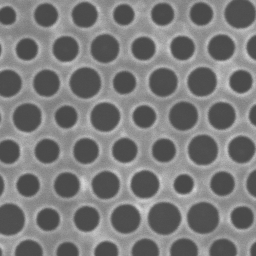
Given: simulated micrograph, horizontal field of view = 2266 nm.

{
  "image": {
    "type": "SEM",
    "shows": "a regular array of holes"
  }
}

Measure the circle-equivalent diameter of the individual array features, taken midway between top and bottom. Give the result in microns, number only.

0.232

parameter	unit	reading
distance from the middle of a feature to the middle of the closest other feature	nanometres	343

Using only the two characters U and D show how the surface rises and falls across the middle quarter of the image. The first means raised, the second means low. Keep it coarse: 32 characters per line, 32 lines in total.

UUUUUUUUUUUUUUUUUUUUUUUUUUUUUUUU
UUUDDDDDUUUUUUUUUUUUUUUDDDDUUUUU
UUDDDDDDDUUUUDDDDUUUUUDDDDDDUUUD
UDDDDDDDDUUUDDDDDDUUUDDDDDDDUUUD
UDDDDDDDDUUUDDDDDDUUUDDDDDDDDUUD
UDDDDDDDDUUUDDDDDDUUUDDDDDDDUUUD
UUDDDDDDDUUUUDDDDUUUUDDDDDDDUUUD
UUUDDDDDUUUUUUDDUUUUUUDDDDDUUUUU
UUUUDDDUUUUUUUUUUUUUUUUUUUUUUUUU
UUUUUUUUUUUUUUUUUUUUUUUUUUUUUDDU
DDUUUUUUDDDDDUUUUUDDDDUUUUUDDDDD
DDDUUUUDDDDDDDUUUUDDDDUUUUUDDDDD
DDDDUUUDDDDDDDUUUDDDDDDUUUDDDDDD
DDDDUUDDDDDDDDUUUDDDDDDUUUDDDDDD
DDDUUUUDDDDDDDUUUDDDDDDUUUUDDDDD
DDUUUUUDDDDDDUUUUUDDDDUUUUUDDDDD
UUUUUUUUDDDDUUUUUUUUUUUUUUUUDDDU
UUUUUUUUUUUUUUUUUUUUUUUUUUUUUUUU
UUUUUDUUUUUUUUUDUUUUUUUUDUUUUUUU
UUUDDDDDUUUUUDDDDDUUUUUDDDDUUUUD
UUDDDDDDDUUUDDDDDDUUUUDDDDDDUUUD
UUDDDDDDDUUUDDDDDDDUUUDDDDDDUUUD
UUDDDDDDDUUUDDDDDDUUUUDDDDDDUUUD
UUUDDDDDUUUUDDDDDDUUUUUDDDDUUUUD
UUUDDDDUUUUUUUDDUUUUUUUUDDUUUUUU
UUUUUUUUUUUUUUUUUUUUUUUUUUUUUUUU
UUUUUUUUUUUUUUUUUUUUUUUUUUUUUUUU
DDUUUUUUDDDDDUUUUUDDDDDUUUUUUUUU
DDDUUUUDDDDDDDUUUDDDDDDDUUUUDDDD
DDDDUUUDDDDDDDUUDDDDDDDDUUUDDDDD
DDDDUUUDDDDDDDUUDDDDDDDDUUUDDDDD
DDDDUUUDDDDDDDUUUDDDDDDDUUUUDDDD